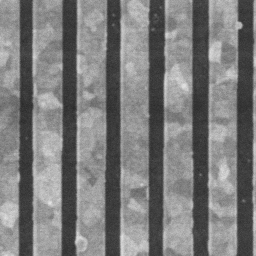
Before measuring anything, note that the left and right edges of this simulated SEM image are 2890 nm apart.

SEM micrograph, lines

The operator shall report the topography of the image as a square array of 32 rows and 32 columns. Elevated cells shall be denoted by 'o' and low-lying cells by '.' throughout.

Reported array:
oo..oooo..ooo..oooo..ooo..oooo..
oo..oooo..ooo..oooo..ooo..oooo..
oo..oooo..ooo..oooo..ooo..oooo..
oo..oooo..ooo..ooo...ooo..oooo..
oo..oooo..ooo..ooo...ooo..oooo..
oo..oooo..ooo..ooo...ooo..oooo..
oo..oooo..ooo..ooo...ooo..oooo..
oo..oooo..ooo..oooo..ooo..oooo..
oo..oooo..ooo..oooo..ooo..oooo..
oo..oooo..ooo..ooo...ooo..oooo..
oo..oooo..ooo..ooo...ooo..oooo..
oo..oooo..ooo..ooo...ooo..oooo..
oo..oooo..ooo..ooo...ooo..oooo..
oo..oooo..ooo..ooo...ooo..oooo..
oo..oooo..ooo..oooo..ooo..oooo..
oo..oooo..ooo..ooo...ooo..oooo..
oo..oooo..ooo..ooo...ooo..oooo..
oo..oooo..ooo..ooo...ooo..oooo..
oo..oooo..ooo..ooo...ooo..oooo..
oo..oooo..ooo..ooo...ooo..oooo..
oo..oooo..ooo..ooo...ooo..oooo..
oo..oooo..ooo..ooo...ooo..oooo..
oo..oooo..ooo..ooo...ooo..oooo..
oo..oooo..ooo..ooo...ooo..oooo..
oo..oooo..ooo..ooo...ooo..oooo..
oo..oooo..ooo..ooo...ooo..oooo..
oo..oooo..ooo..ooo...ooo..oooo..
oo..oooo..ooo..ooo..oooo..oooo..
oo..oooo..ooo..ooo...ooo..oooo..
oo..oooo..ooo..ooo..oooo..oooo..
oo..oooo.oooo..ooo..oooo..oooo..
oo..oooo..ooo..ooo..oooo..oooo..